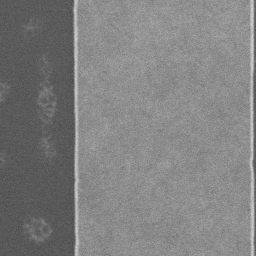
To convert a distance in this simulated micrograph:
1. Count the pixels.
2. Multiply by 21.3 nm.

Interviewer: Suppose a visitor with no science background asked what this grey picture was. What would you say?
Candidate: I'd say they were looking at one or a few lines or trenches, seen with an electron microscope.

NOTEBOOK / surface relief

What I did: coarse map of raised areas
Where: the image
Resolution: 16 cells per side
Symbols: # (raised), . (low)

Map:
.....###########
.....###########
.....###########
.....###########
.....###########
.....###########
.....###########
.....###########
.....###########
.....###########
.....###########
.....###########
.....###########
.....###########
.....###########
.....###########